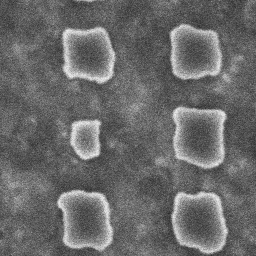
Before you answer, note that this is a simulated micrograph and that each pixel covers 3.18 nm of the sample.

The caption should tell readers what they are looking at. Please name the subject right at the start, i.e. raised bodies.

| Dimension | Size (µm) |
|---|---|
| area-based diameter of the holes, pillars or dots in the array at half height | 0.18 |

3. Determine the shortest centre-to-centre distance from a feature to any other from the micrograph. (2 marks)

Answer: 0.272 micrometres